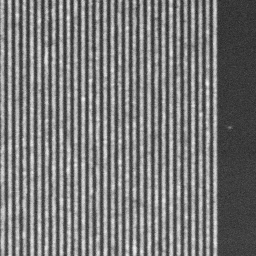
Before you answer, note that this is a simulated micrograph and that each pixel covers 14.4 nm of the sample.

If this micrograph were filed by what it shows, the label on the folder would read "parallel lines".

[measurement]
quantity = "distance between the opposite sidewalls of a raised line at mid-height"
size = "30.6 nm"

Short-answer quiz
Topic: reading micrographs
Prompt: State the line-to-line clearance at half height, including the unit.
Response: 70.2 nm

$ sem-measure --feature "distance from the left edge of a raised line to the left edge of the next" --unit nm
106